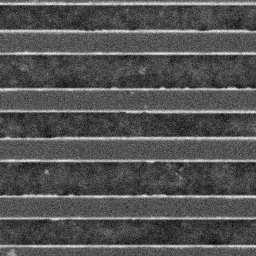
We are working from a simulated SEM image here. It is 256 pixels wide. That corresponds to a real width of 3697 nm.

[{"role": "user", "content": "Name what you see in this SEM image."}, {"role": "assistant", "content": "lines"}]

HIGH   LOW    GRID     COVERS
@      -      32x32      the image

@@@@@@@@@@@@@@@@@@@@@@@@@@@@@@@@
--------------------------------
--------------------------------
--------------------------------
@@@@@@@@@@@@@@@@@@@@@@@@@@@@@@@@
@@@@@@@@@@@@@@@@@@@@@@@@@@@@@@@@
@@@@@@@@@@@@@@@@@@@@@@@@@@@@@@@@
--------------------------------
--------------------------------
--------------------------------
--------------------------------
@@@@@@@@@@@@@@@@@@@@@@@@@@@@@@@@
@@@@@@@@@@@@@@@@@@@@@@@@@@@@@@@@
@@@@@@@@@@@@@@@@@@@@@@@@@@@@@@@@
--------------------------------
--------------------------------
--------------------------------
@@@@@@@@@@@@@@@@@@@@@@@@@@@@@@@@
@@@@@@@@@@@@@@@@@@@@@@@@@@@@@@@@
@@@@@@@@@@@@@@@@@@@@@@@@@@@@@@@@
--------------------------------
--------------------------------
--------------------------------
--------------------------------
--------------------------------
@@@@@@@@@@@@@@@@@@@@@@@@@@@@@@@@
@@@@@@@@@@@@@@@@@@@@@@@@@@@@@@@@
--------------------------------
--------------------------------
--------------------------------
--------------------------------
@@@@@@@@@@@@@@@@@@@@@@@@@@@@@@@@